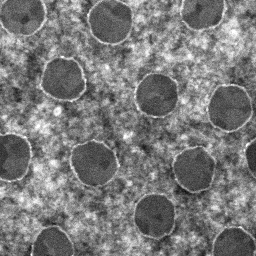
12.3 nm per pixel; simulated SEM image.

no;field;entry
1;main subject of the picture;raised bodies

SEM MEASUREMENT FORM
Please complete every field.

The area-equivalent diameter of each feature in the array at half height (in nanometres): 547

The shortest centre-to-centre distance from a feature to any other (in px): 72.1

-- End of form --